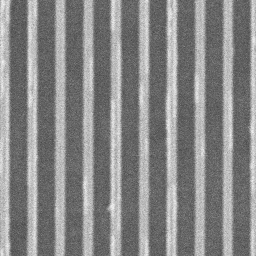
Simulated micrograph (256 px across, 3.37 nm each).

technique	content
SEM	parallel lines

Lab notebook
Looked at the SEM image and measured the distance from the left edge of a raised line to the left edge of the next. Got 94.1 nm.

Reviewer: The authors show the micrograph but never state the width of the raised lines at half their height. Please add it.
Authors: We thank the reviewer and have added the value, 30.7 nm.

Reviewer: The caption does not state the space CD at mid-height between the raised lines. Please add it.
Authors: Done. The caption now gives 64.8 nanometers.